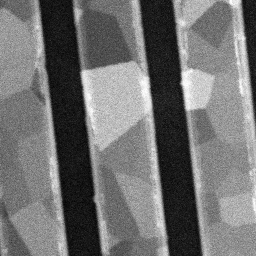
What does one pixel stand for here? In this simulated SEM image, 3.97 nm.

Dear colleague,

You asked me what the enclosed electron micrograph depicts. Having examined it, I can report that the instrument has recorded one or a few lines or trenches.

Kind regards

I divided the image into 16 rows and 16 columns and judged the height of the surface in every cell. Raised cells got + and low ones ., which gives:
++...++++..++++.
++...++++..++++.
+++..++++..++++.
+++..++++..++++.
+++..++++..++++.
+++..++++...++++
+++..++++...++++
+++...+++...++++
+++...++++..++++
+++...++++..++++
+++...++++..++++
++++..++++..++++
++++..++++..++++
++++..++++...+++
++++..++++...+++
++++..++++...+++